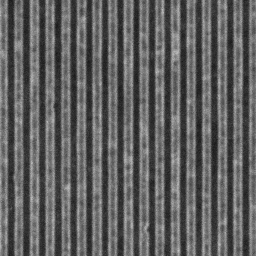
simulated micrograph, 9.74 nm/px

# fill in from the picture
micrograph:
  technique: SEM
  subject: parallel lines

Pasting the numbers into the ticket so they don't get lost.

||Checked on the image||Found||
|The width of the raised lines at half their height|0.067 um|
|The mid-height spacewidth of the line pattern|82.8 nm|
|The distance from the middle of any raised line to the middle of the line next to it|15.7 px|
